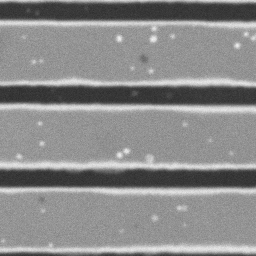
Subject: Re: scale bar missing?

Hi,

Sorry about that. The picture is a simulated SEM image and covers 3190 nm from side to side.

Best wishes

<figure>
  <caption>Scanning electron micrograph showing lines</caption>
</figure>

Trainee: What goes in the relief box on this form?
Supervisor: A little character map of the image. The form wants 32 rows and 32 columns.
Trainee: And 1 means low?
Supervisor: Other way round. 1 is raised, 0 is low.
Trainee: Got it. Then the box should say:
00000000000000000000000000000000
00000000000000000000000000000000
00000000000000000000000000000000
11111111111111111111111111111111
11111111111111111111111111111111
11111111111111111111111111111111
11111111111111111111111111111111
11111111111111111111111111111111
11111111111111111111111111111111
11111111111111111111111111111111
11111111111111111111111111111111
00000000000000000000000000000000
00000000000000000000000000000000
11111111111111111111111111111111
11111111111111111111111111111111
11111111111111111111111111111111
11111111111111111111111111111111
11111111111111111111111111111111
11111111111111111111111111111111
11111111111111111111111111111111
11111111111111111111111111111111
00000000000000000000000000000000
00000000000000000000000000000000
11111111111110000000000000010000
11111111111111111111111111111111
11111111111111111111111111111111
11111111111111111111111111111111
11111111111111111111111111111111
11111111111111111111111111111111
11111111111111111111111111111111
11111111111111111111111111111111
11000011000111111011011111111111